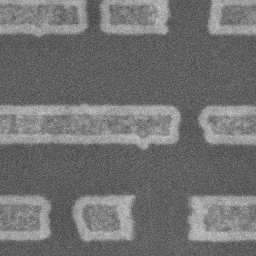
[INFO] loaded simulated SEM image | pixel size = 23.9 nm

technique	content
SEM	one or a few lines or trenches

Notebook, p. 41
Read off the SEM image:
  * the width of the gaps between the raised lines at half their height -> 79.4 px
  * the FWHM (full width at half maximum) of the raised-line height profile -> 0.712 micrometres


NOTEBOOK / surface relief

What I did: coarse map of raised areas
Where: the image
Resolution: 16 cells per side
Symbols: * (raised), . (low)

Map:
*****..***....**
*****..***...***
................
................
................
................
................
***********..***
***********..***
................
................
................
**..............
***..***....****
***..***.....***
................